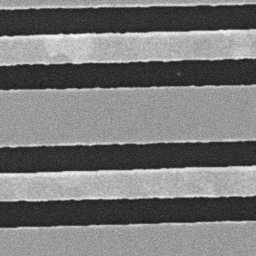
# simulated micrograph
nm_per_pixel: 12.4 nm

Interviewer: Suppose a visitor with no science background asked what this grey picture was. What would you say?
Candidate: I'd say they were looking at lines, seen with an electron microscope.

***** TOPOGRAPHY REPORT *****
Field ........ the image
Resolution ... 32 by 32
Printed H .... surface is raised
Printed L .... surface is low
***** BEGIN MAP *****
HHHHHHHHHHHHHHHHHHHHHHHHHHHHHHHL
LLLLLLLLLLLLLLLLLLLLLLLLLLLLLLLL
LLLLLLLLLLLLLLLLLLLLLLLLLLLLLLLL
LLLLLLLLLLLLLLLLLLLLLLLLLLLLLLLL
LLLLLHHHHHHHHHHHHHHHHHHHHHHHHHHH
HHHHHHHHHHHHHHHHHHHHHHHHHHHHHHHH
HHHHHHHHHHHHHHHHHHHHHHHHHHHHHHHH
HHHHHHHHHHHHHHHHHHHHHHHLLLHLLLLL
LLLLLLLLLLLLLLLLLLLLLLLLLLLLLLLL
LLLLLLLLLLLLLLLLLLLLLLLLLLLLLLLL
LLLLLLLLLLLLLLLLLLLLLLLLLLLLLLLL
HHHHHHHHHHHHHHHHHHHHHHHHHHHHHHHH
HHHHHHHHHHHHHHHHHHHHHHHHHHHHHHHH
HHHHHHHHHHHHHHHHHHHHHHHHHHHHHHHH
HHHHHHHHHHHHHHHHHHHHHHHHHHHHHHHH
HHHHHHHHHHHHHHHHHHHHHHHHHHHHHHHH
HHHHHHHHHHHHHHHHHHHHHHHHHHHHHHHH
HHHHHHHHHHHHHHHHHHHHHHHHHHHHHHHL
LLLLLLLLLLLLLLLLLLLLLLLLLLLLLLLL
LLLLLLLLLLLLLLLLLLLLLLLLLLLLLLLL
LLLLLLLLLLLLLLLLLLLLLLLLLLLLLLLL
LLLLLLLLHHHHHHHHHHHHHHHHHHHHHHHH
HHHHHHHHHHHHHHHHHHHHHHHHHHHHHHHH
HHHHHHHHHHHHHHHHHHHHHHHHHHHHHHHH
HHHHHHHHHHHHHHHHHHHHHHHHHHHHHLHL
LLLLLLLLLLLLLLLLLLLLLLLLLLLLLLLL
LLLLLLLLLLLLLLLLLLLLLLLLLLLLLLLL
LLLLLLLLLLLLLLLLLLLLLLLLLLLLLLLL
LLHHHHHHHHHHHHHHHHHHHHHHHHHHHHHH
HHHHHHHHHHHHHHHHHHHHHHHHHHHHHHHH
HHHHHHHHHHHHHHHHHHHHHHHHHHHHHHHH
HHHHHHHHHHHHHHHHHHHHHHHHHHHHHHHH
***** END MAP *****